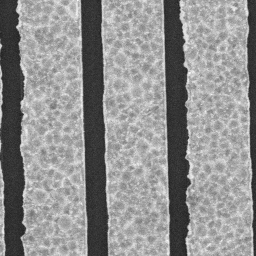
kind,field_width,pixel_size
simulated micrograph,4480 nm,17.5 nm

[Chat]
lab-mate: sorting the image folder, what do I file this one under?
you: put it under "one or a few lines or trenches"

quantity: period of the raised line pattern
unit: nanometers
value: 1450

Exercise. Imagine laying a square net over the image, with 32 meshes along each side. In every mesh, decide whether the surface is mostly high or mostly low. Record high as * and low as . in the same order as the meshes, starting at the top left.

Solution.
...*******...*******...********.
..********...*******...********.
..********...*******...********.
..********...*******...********.
...*******...*******...********.
..********...*******...********.
..********...*******...********.
...*******...*******...********.
...*******...********..********.
...*******...********..********.
...*******...********..********.
...*******...********..********.
...*******...********..********.
...*******...********..********.
...*******...********..********.
...*******...********..********.
...*******...********...*******.
...*******...********...*******.
...*******...********...*******.
...*******...********..********.
...*******...********...*******.
...********..********...*******.
...********..********...*******.
...********..********...*******.
...********..********..********.
...********..********..*********
...********...*******...********
...********...*******...********
...********...*******...*******.
...********...*******..********.
*..********...*******..*********
*..********...*******...********